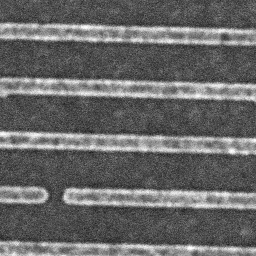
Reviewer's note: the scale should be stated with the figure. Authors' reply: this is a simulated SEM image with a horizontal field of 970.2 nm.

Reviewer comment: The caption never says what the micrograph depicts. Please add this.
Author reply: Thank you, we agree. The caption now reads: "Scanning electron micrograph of parallel lines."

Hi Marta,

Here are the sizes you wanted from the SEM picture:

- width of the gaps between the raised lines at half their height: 158 nanometres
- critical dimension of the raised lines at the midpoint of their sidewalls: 48.8 nanometres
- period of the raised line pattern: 206 nanometers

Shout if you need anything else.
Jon